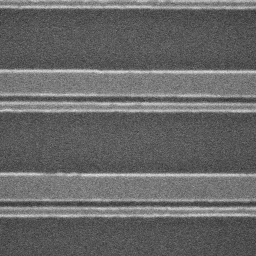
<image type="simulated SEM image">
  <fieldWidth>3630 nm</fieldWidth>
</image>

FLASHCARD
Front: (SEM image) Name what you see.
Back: lines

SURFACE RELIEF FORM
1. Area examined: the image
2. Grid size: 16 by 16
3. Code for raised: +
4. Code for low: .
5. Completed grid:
................
................
................
................
++++++++++++++++
++++++++++++++++
++++++++++++++++
................
................
................
................
++++++++++++++++
++++++++++++++++
................
................
................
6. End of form